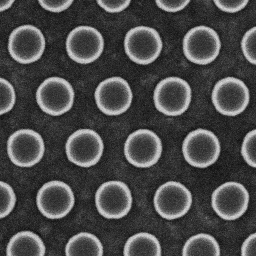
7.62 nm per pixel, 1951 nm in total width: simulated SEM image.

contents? a regular array of raised bodies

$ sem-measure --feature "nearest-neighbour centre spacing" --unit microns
0.445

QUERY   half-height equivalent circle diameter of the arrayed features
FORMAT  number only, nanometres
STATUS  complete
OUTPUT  265